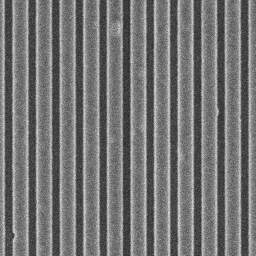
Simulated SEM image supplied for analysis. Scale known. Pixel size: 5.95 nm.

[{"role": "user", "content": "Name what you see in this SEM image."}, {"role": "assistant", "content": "parallel lines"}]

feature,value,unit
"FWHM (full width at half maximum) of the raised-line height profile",87.1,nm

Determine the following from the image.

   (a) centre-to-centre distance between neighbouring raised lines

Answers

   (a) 140 nm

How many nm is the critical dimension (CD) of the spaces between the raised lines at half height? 54.3